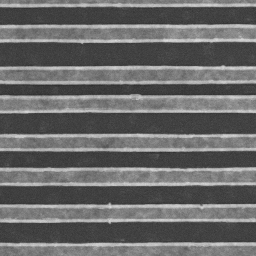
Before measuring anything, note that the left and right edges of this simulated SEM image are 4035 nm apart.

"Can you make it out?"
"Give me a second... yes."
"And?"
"parallel lines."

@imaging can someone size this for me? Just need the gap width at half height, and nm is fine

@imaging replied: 335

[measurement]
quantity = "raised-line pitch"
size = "567 nanometers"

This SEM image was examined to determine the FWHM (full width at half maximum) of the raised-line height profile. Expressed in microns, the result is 0.236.